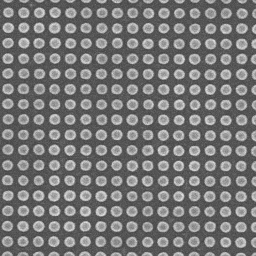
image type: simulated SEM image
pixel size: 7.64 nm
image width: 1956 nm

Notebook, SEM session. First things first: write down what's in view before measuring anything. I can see a regular array of raised bodies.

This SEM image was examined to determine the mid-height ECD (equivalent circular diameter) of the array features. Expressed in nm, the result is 78.6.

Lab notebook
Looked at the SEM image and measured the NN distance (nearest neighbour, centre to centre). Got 115 nm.